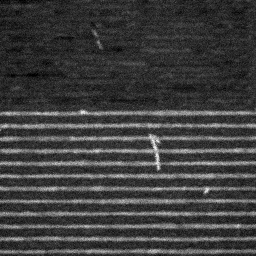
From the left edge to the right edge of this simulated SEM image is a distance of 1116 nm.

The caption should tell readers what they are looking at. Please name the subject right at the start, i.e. parallel lines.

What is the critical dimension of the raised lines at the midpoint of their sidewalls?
13.1 nanometers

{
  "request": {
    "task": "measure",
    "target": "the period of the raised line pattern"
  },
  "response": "0.0548 micrometres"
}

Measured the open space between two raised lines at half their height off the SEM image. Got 41.9 nm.